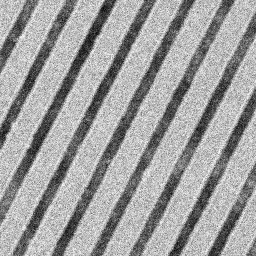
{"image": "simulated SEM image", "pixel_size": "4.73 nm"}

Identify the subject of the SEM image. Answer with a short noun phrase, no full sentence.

parallel lines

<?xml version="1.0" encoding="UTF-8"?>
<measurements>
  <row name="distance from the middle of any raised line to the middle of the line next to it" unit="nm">164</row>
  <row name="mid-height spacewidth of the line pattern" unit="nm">63.5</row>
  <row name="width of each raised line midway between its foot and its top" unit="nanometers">100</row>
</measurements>